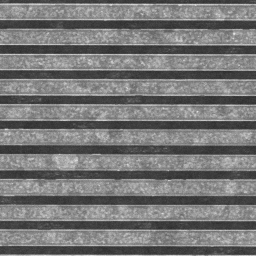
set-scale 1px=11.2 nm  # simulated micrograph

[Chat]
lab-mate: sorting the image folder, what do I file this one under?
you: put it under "parallel lines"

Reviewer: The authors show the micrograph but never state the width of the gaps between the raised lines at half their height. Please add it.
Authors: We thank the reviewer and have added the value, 109 nm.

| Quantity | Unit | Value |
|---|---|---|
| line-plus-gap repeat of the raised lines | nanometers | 281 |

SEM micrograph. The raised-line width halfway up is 0.173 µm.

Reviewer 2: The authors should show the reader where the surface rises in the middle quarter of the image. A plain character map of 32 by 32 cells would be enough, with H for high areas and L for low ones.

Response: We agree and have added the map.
HHHHHHHHHHHHHHHHHHHHHHHHHHHHHHHH
LLLLLLLLLLLLLLLLLLLLLLLLHHHHHHHH
LLLLLLLLLLLLLLLLLLLLLLLLLLLLLLLL
LLLLLLLLLLLLLLLLLLLLLLLLLLLLLLLL
HHHHHHHHHHHHHHHHHHHHHHHHHHHHHHHH
HHHHHHHHHHHHHHHHHHHHHHHHHHHHHHHH
HHHHHHHHHHHHHHHHHHHHHHHHHHHHHHHH
HHHHHHHHHHHHHHHHHHHHHHHHHHHHHHHH
LLLLLLLLLLLLLLLLLLLLLLLLLLLLLLLL
LLLLLLLLLLLLLLLLLLLLLLLLLLLLLLLL
HHHHHHHHHHHHHHHHHHHHHHHHHHHHHHHH
HHHHHHHHHHHHHHHHHHHHHHHHHHHHHHHH
HHHHHHHHHHHHHHHHHHHHHHHHHHHHHHHH
HHHHHHHHHHHHHHHHHHHHHHHHHHHHHHHH
LLLLLLLLLLLLLLLLLLLLLLLLLLLLLLLL
LLLLLLLLLLLLLLLLLLLLLLLLLLLLLLLL
HHHHLLLLLLLLLLLLLLLLLLLLLLLLLLLL
HHHHHHHHHHHHHHHHHHHHHHHHHHHHHHHH
HHHHHHHHHHHHHHHHHHHHHHHHHHHHHHHH
HHHHHHHHHHHHHHHHHHHHHHHHHHHHHHHH
LLLLLLLLLLLLLLLLLLLLLLLLLLLLLLLL
LLLLLLLLLLLLLLLLLLLLLLLLLLLLLLLL
LLLLLLLLLLLLLLLLLLLLLLLLLLLLLLLL
HHHHHHHHHHHHHHHHHHHHHHHHHHHHHHHH
HHHHHHHHHHHHHHHHHHHHHHHHHHHHHHHH
HHHHHHHHHHHHHHHHHHHHHHHHHHHHHHHH
LLLLLLLLLLLLLLLLLLLLLLLLLLLLLLLL
LLLLLLLLLLLLLLLLLLLLLLLLLLLLLLLL
LLLLLLLLLLLLLLLLLLLLLLLLLLLLLLLL
HHHHHHHHHHHHHHHHHHHHHHHHHHHHHHHH
HHHHHHHHHHHHHHHHHHHHHHHHHHHHHHHH
HHHHHHHHHHHHHHHHHHHHHHHHHHHHHHHH